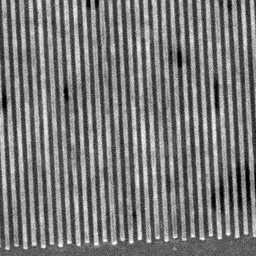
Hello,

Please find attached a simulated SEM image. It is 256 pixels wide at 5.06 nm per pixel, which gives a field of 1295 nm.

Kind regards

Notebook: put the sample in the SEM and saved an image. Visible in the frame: parallel lines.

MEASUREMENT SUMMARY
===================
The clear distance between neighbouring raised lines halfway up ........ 5.38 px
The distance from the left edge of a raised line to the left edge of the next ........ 44.8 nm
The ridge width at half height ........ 18.3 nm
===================